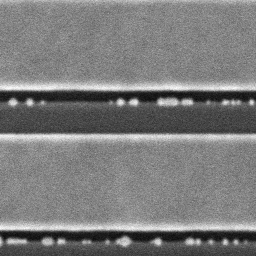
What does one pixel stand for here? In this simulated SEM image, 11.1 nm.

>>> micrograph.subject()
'lines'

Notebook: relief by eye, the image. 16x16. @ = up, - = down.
@@@@@@@@@@@@@@@@
@@@@@@@@@@@@@@@@
@@@@@@@@@@@@@@@@
@@@@@@@@@@@@@@@@
@@@@@@@@@@@@@@@@
@@@@@@@@@@@@@@@@
----------------
----------------
@@@@@@@@@@@@@@@@
@@@@@@@@@@@@@@@@
@@@@@@@@@@@@@@@@
@@@@@@@@@@@@@@@@
@@@@@@@@@@@@@@@@
@@@@@@@@@@@@@@@@
----------------
----------------